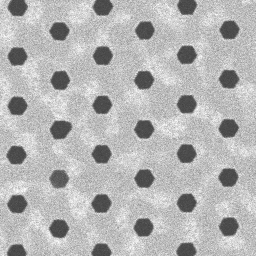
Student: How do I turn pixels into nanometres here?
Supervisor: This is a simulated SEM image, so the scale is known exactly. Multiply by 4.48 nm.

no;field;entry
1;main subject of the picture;a regular array of holes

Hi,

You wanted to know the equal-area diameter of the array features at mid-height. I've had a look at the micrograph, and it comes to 86.5 nanometers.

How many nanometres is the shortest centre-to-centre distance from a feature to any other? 217